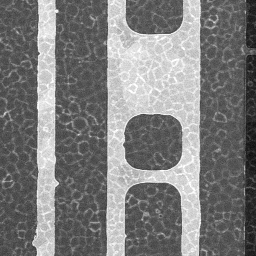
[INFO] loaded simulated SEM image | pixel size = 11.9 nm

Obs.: one or a few lines or trenches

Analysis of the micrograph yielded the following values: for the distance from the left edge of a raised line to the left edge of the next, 841 nanometres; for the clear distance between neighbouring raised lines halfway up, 623 nanometres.